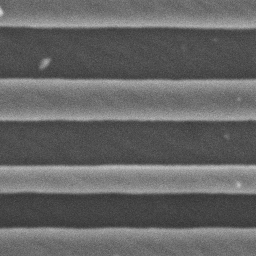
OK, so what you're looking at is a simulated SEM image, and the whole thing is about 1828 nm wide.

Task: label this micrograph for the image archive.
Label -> lines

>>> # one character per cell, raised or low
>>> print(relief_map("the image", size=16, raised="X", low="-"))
XXXXXXXXXXXXXXXX
XXXXXXXXXXXXXXXX
----------------
----------------
----------------
XXXXXXXXXXXXXXXX
XXXXXXXXXXXXXXXX
----------------
----------------
----------------
XXXXXXXXXXXXXXXX
XXXXXXXXXXXXXXXX
----------------
----------------
XXXXXXXXXXXXXXXX
XXXXXXXXXXXXXXXX